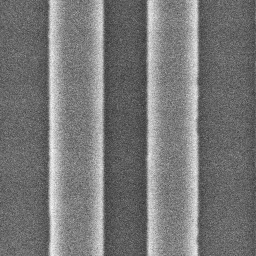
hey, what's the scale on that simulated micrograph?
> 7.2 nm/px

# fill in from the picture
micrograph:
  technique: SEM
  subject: lines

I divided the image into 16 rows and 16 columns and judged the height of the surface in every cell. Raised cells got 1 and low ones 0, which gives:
0001110001110000
0001110001110000
0001110001110000
0001110001110000
0001110001110000
0001110001110000
0001110001110000
0001110001110000
0001110001110000
0001110001110000
0001110001110000
0001110001110000
0001110001110000
0001110001110000
0001110001110000
0001110001110000